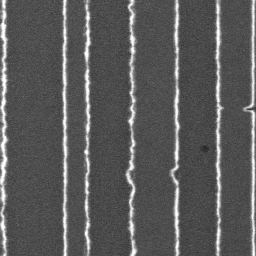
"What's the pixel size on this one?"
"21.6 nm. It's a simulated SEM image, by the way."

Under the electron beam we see one or a few lines or trenches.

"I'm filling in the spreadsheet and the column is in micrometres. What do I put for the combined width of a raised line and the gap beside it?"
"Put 1.72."